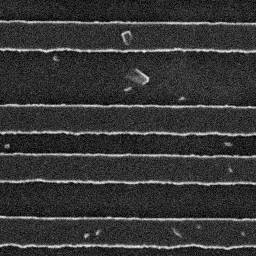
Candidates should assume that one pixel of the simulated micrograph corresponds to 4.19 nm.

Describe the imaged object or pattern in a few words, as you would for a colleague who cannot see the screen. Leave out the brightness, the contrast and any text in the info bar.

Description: lines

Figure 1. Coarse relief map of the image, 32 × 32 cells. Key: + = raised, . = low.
................................
................................
................................
++++++++++++++++++++++++++++++++
++++++++++++++++++++++++++++++++
++++++++++++++++++++++++++++++++
................................
................................
................................
.................+..............
................................
................................
................................
++++++++++++++++++++++++++++++++
++++++++++++++++++++++++++++++++
++++++++++++++++++++++++++++++++
++++++++++++++++++++++++++++++++
................................
................................
+++++++++++++++++++++++.........
++++++++++++++++++++++++++++++++
++++++++++++++++++++++++++++++++
++++++++++++++++++++++++++++++++
................................
................................
................................
................................
++++++++++++++++++++++++++++++++
++++++++++++++++++++++++++++++++
++++++++++++++++++++++++++++++++
++++++++++++++++++++++++++++++++
................................